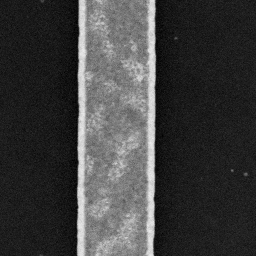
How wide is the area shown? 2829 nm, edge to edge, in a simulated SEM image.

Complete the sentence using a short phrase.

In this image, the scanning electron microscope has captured one or a few lines or trenches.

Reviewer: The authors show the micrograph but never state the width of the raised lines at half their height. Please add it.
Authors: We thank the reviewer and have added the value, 0.771 microns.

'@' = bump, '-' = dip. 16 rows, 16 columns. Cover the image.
-----@@@@-------
-----@@@@-------
-----@@@@-------
-----@@@@-------
-----@@@@-------
-----@@@@-------
-----@@@@-------
-----@@@@-------
-----@@@@-------
-----@@@@-------
-----@@@@-------
-----@@@@-------
-----@@@@-------
-----@@@@-------
-----@@@@-------
-----@@@@-------